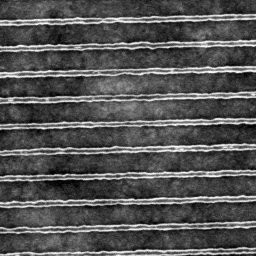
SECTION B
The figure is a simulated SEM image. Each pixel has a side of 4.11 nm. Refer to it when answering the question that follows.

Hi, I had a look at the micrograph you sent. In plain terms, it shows parallel lines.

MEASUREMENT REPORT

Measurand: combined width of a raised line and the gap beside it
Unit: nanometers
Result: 107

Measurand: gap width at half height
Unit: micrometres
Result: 0.0863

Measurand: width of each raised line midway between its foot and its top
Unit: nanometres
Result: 19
